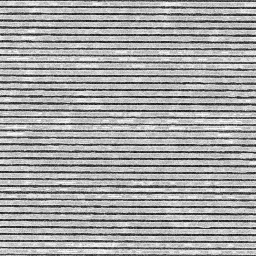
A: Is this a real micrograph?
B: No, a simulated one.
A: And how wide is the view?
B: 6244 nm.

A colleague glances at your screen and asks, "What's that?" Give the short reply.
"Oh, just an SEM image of parallel lines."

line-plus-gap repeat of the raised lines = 0.168 micrometres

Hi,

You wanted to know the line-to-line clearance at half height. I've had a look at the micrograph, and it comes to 57.9 nm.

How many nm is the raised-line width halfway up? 113